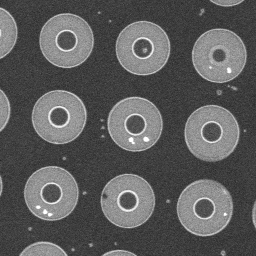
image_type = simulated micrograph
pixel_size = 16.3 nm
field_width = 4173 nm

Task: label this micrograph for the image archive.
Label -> an array of small figures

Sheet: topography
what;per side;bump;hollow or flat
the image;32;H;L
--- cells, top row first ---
HHHHHHHHHHHHHHHHHHHHHHHHHHHLLHHH
LHHHHHHHHHHHHHHHHHHHHHHHHHHHHHHH
LLHHHHLLLLHHHHHHHHHHHHHHHHHHHHHH
LLHHHLLLLLLHHHHHLLLLHHHHHHHHHHHH
LLHHHLLHHLLLHHHLLLLLLHHHHLLLLLHH
LLHHHLLHHHLLHHHLLHHLLHHHLLLLLLHH
LHHHHLLLLLLHHHHLLHHLLHHHLLHHLLLH
HHHHHHLLLLLHHHHLLLLLLHHHLLLHLLLH
HHHHHHHHHHHHHHHHLLLLHHHHLLLLLLHH
HHHHHHHHHHHHHHHHHHHHHHHHHLLLLLHH
HHHHHHHHHHHHHHHHHHHHHHHHHHHHHHHH
HHHHHHLLHHHHHHHHHHHHHHHHHHHHHHHH
LHHHHLLLLLHHHHHHLLHHHHHHHHHHHHHH
LHHHLLLHLLLHHHLLLLLHHHHHHLLLHHHH
LHHHLLHHHLLHHHLLHHLLHHHHLLLLLHHH
LHHHLLLHLLLHHHLLHHLLHHHLLLHLLLHH
HHHHHLLLLLHHHHLLHHLLHHHLLHHHLLHH
HHHHHHLLLHHHHHLLLLLLHHHLLLHLLLHH
HHHHHHHHHHHHHHHLLLHHHHHHLLLLLHHH
HHHHHHHHHHHHHHHHHHHHHHHHHLLLHHHH
HHHHHHHHHHHHHHHHHHHHHHHHHHHHHHHH
HHHHLLLLHHHHHHHHHHHHHHHHHHHHHHHH
HHHHLLLLLHHHHHLLLLHHHHHHHHHHHHHH
HHHLLHHHLLHHHLLLLLLHHHHLLLLLHHHH
HHHLLHHHLLHHHLLHHLLHHHHLLLLLLHHH
HHHLLLLLLHHHHLLHHLLHHHLLHHHLLHHH
HHHHLLLLLHHHHLLLLLLHHHLLHHHLLHHH
HHHHHHLHHHHHHHLLLLHHHHHLLLLLLHHH
HHHHHHHHHHHHHHHHHHHHHHHLLLLLHHHH
HHHHHHHHHHHHHHHHHHHHHHHHHHHHHHHH
HHHHLLHHHHHHHHHHHHHHHHHHHHHHHHHH
HHHLLLLLHHHHHHLLHHHHHHHHHHHHHHHH